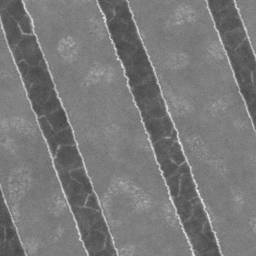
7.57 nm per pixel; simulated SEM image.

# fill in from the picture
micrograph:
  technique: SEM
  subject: one or a few lines or trenches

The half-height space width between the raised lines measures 523 nanometers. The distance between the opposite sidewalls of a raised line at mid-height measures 0.218 micrometres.